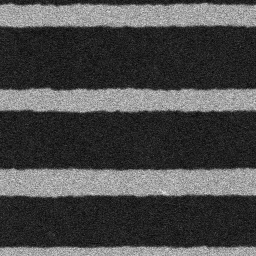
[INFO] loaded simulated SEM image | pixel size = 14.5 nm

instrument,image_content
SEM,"one or a few lines or trenches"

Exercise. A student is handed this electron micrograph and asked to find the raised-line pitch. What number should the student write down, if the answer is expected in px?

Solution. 81.7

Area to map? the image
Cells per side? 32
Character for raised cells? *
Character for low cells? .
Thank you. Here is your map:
*************************.******
................................
................................
********************************
********************************
********************************
********************************
********************************
********************************
********************************
********************************
................................
................................
................................
********************************
********************************
********************************
********************************
********************************
********************************
********************************
................................
................................
................................
*****..*************************
********************************
********************************
********************************
********************************
********************************
********************************
................................